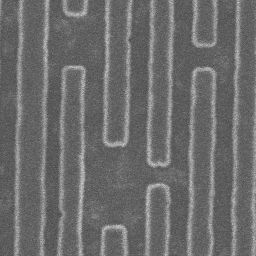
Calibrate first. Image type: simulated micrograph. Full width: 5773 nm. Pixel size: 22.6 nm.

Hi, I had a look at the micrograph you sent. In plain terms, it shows parallel lines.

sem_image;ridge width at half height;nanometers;493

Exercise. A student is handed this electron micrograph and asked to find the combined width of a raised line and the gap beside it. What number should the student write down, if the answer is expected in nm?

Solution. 967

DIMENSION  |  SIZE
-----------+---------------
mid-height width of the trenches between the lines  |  471 nanometres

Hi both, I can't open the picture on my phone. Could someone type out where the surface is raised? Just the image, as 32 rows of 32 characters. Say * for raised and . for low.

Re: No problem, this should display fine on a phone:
...***..***..***...**...***...**
..****..***..***...**...***...**
..****.......***...***..***...**
...***.......***...***..***...**
...***.......***...**...***...**
...***.......***...**...***...**
..****.......***...**.........**
..****.......***...**.........**
..****..**...***...**.........**
..****..***..***...**...***..***
..****..**...***...**...***..***
..****..**...***...**...***..***
..****..**...***...**...***..***
..****..**...***...**...***..***
..****..**...***...**...***..***
..****..**...***...**...***..***
..****..**...***...**...***..***
..****..**...***...**...***..***
..****..**.........**...***..***
..****..**........***...***..***
..****..**.........**...***..***
..****..**..............***..***
..***...**..............***..***
..****..**.........**...***..***
..***...**........***...***..***
..****..**........***...**...***
..****..**........***...**...***
..***...**........***...**...***
..***...**...**...***...**...***
..***..***...***..***...**...***
..***..***...***..***...***..***
..***..***...***..***...**...***